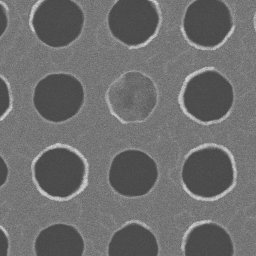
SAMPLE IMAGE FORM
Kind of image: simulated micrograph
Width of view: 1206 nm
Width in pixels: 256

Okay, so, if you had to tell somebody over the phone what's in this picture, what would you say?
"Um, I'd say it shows holes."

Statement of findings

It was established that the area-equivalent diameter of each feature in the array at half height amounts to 49.3 px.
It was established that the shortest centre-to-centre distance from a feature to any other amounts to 0.353 micrometres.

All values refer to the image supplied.